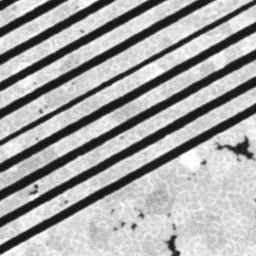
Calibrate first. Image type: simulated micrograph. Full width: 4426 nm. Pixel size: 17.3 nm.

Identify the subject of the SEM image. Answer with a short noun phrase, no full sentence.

parallel lines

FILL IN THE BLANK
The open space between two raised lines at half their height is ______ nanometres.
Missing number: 170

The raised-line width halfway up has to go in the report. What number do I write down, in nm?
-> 234